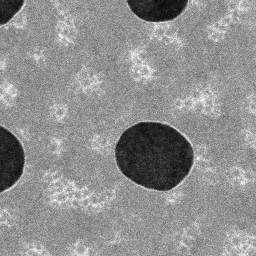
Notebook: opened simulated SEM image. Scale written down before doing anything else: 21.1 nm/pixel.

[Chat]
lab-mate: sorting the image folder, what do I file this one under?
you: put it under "holes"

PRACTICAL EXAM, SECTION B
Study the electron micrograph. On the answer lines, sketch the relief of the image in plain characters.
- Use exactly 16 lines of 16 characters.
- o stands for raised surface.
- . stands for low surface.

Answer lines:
.ooooooo....oooo
oooooooooooooooo
oooooooooooooooo
oooooooooooooooo
oooooooooooooooo
oooooooooooooooo
oooooooooooooooo
oooooooooooooooo
.ooooooo...ooooo
.oooooo.....oooo
.oooooo.....oooo
.oooooooo..ooooo
oooooooooooooooo
oooooooooooooooo
oooooooooooooooo
oooooooooooooooo